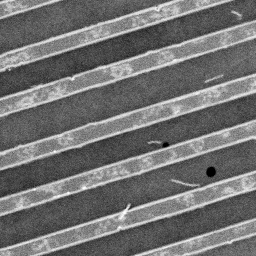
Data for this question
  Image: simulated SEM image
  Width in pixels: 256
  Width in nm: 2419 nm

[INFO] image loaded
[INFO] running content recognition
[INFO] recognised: parallel lines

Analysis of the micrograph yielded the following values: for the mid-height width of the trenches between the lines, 280 nm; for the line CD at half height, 148 nanometers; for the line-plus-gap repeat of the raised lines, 442 nanometers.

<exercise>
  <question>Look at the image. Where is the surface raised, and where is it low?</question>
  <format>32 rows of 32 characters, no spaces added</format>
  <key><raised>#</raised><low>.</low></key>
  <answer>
######...............######.....
###..............#######........
..............#######...........
...........#######...........###
........######............######
.....######............######...
.#######...........#######......
#####...........#######.........
#...........#######.............
.........#######...............#
......#######...............####
...#######...............#######
######...............########...
###...............#######.......
...............#######..........
...........########............#
........#######.............####
.....#######............#######.
..#######............######.....
######............######........
##.............######...........
...........#######..............
........######..............####
.....######..............#######
..######..............#######...
#####..............#######......
#..............########.........
............#######.............
.........#######.............###
......#######............######.
..#######.............######....
######............#######.......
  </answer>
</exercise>